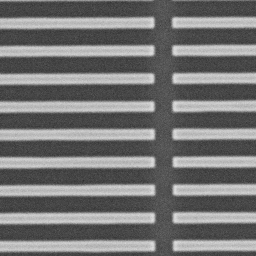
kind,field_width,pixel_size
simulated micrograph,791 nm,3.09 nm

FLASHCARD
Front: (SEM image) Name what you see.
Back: groups of lines, slits or small figures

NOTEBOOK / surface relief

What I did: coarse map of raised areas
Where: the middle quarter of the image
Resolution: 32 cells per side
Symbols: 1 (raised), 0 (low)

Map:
00000000000000000000000000000000
00000000000000000000000000000000
00000000000000000000000000000000
11111111111111111111110000011111
11111111111111111111110000011111
00000000000000000000000000000000
00000000000000000000000000000000
00000000000000000000000000000000
00000000000000000000000000000000
00000000000000000000010000011111
11111111111111111111111000011111
11111111111111111111111000011111
00000000000000000000000000000000
00000000000000000000000000000000
00000000000000000000000000000000
00000000000000000000000000000000
11111111111111111111111000011111
11111111111111111111111000011111
11111111111111111111111000011111
00000000000000000000000000000000
00000000000000000000000000000000
00000000000000000000000000000000
00000000000000000000000000000000
00000000000000000111000000000001
11111111111111111111111000011111
11111111111111111111111000011111
00000000000000000000000000000000
00000000000000000000000000000000
00000000000000000000000000000000
00000000000000000000000000000000
00000011111111111111111000011111
11111111111111111111111000011111